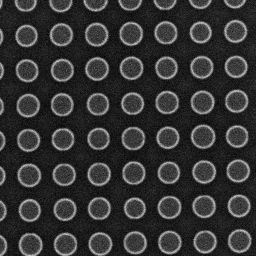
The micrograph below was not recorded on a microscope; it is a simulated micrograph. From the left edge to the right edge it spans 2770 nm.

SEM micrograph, an array of small figures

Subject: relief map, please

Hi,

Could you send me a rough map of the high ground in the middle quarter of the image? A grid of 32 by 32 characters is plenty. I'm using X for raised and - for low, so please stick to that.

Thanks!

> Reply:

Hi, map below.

XX----XXXXX---XXXXXX---XXXXX----
XX---XXXXXX---XXXXXX---XXXXX----
XX----XXXXX----XXXX----XXXXX----
XX----XXXX------XX-------X------
--------------------------------
--------------------------------
--------------------------------
---------X------XX------XXXX----
XX----XXXXX----XXXXX---XXXXX----
XX----XXXXX---XXXXXX---XXXXX----
XX----XXXXX---XXXXXX---XXXXX----
XX----XXXXX----XXXX-----XXXX----
X-------XX----------------------
--------------------------------
--------------------------------
--------------------------------
X------XXX-----XXXX-----XXXX----
XX----XXXXX----XXXXX---XXXXXX---
XX----XXXXX----XXXXX---XXXXXX---
XX----XXXXX----XXXXX----XXXX----
XX-----XXXX----XXXXX----XXXX----
--------------------------------
--------------------------------
--------------------------------
--------------------------------
XX-----XXXX----XXXXX----XXXX----
XX----XXXXX----XXXXX----XXXXX---
XXX---XXXXXX---XXXXX----XXXXX---
XXX---XXXXX----XXXXX----XXXXX---
XX-----XXXX-----XXX------XX-----
--------------------------------
--------------------------------